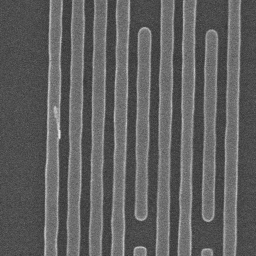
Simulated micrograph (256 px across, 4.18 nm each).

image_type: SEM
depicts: groups of lines, slits or small figures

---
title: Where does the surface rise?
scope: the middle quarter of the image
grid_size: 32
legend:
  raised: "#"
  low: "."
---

..###..###...###...###..###...##
..###..###...###...###..###...##
..###..###...###..####..###...##
..###..###...###..####..###...##
..##...###...###..####..###...##
..##...###...###..###...###..###
..##...###...###..###...###..###
..##...###...###..###...###..###
..##...###...###..###...###..###
..##...###...###..###...###..###
..##...###...###..###...###..###
..##...###...###..###...###..###
..##...###...###..###...###..###
..##...###...###..###...###...##
..##...###...###..###...###...##
..##...###...###..###...###..###
..##...###...###..###...###..###
..##...###...###..###...###..###
..##...###...###..###...###..###
..##...###...###..###...###..###
..##...###...###..###...##...###
..##...###...##...###...##...###
..##...###...##...###...##...###
.###...###...##...###...##...###
.###...###...##...###...##...###
.###...###...##...###...##...###
.###...###...##...###...##...###
.###...###...##...###...##...###
.###...###...##...###...##...###
.###...###..###...###...##...###
.###...###..###...###...##...###
.###...###..###...###...##...###